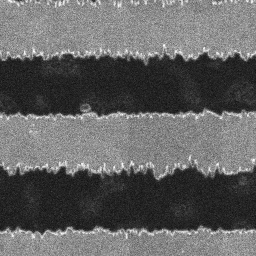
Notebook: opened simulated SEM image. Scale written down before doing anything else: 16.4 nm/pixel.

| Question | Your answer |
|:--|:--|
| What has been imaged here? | one or a few lines or trenches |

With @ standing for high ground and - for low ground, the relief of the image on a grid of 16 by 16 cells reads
----------------
----------------
----------------
@@@@@@@@@@@@@@@@
@@@@@@@@@@@@@@@@
@@@@@@@@@@@@@@@@
@@@@@@@@@@@@@@@@
----------------
----------------
----------------
--@@----@--@----
@@@@@@@@@@@@@@@@
@@@@@@@@@@@@@@@@
@@@@@@@@@@@@@@@@
@@@@-@-@-@@@----
----------------